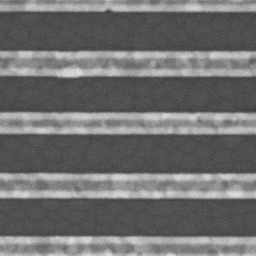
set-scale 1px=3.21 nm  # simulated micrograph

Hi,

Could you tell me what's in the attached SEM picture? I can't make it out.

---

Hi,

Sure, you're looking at one or a few lines or trenches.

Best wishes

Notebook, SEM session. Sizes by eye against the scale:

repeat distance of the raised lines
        196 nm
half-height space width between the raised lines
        146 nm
